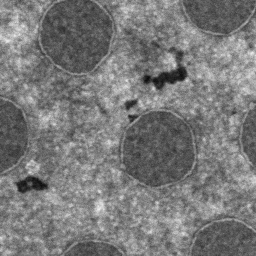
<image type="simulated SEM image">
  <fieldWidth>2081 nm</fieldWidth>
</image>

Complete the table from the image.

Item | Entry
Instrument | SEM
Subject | raised bodies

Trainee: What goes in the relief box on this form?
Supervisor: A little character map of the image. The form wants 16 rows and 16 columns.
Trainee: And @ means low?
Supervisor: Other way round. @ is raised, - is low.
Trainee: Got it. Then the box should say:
---@@@-----@@@@@
---@@@@-----@@@-
--@@@@@---------
---@@@@---------
----@@----------
----------------
@---------------
@@------@@@----@
@@------@@@@---@
@@------@@@@---@
@-------@@@@----
---------@@-----
----------------
----------------
------------@@@@
----@@@-----@@@@